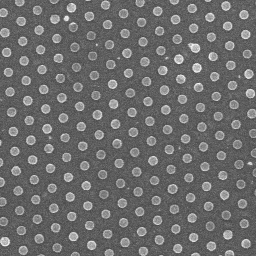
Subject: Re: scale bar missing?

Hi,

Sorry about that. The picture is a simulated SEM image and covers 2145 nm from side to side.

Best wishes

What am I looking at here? a regular array of raised bodies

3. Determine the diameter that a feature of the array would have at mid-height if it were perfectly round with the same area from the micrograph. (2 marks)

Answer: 75.1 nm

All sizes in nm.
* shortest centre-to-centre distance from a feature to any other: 164